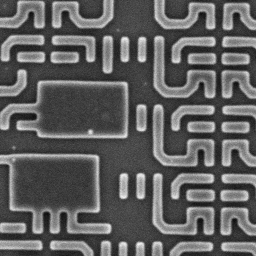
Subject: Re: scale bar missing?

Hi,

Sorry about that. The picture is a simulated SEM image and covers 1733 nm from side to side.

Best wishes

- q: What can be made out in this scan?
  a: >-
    wiring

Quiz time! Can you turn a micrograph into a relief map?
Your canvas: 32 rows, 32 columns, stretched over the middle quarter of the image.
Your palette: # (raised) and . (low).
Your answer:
..........##...........##.......
..........##...........##.......
.......................##......#
.......................##......#
#####..................##......#
################.......###....##
################.......#########
################........########
################................
################................
################...#...#......##
################..##..###...####
################..##..###..###..
################..##..###..##...
################..##..###..##...
################..##..###..##..#
################...#..###......#
################......###.......
......................###.......
......................###......#
......................###......#
......................###......#
......................###......#
########...............#########
########................########
########........................
########........................
########......#....#...#.....###
########......##..##..##....####
########......##..##..##...#####
#########.....##..##..##...##...
#########.....##..##..##...##...